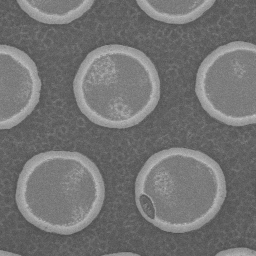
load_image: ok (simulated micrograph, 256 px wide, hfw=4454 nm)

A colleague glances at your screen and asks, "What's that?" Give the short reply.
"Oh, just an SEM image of raised bodies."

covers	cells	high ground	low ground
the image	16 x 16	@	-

--@@@----@@@@---
----------------
----------------
@-----@@@----@@@
@@---@@@@@---@@@
@@---@@@@@--@@@@
@@---@@@@@---@@@
@-----@@------@@
----------------
----------------
--@@@@---@@@@---
-@@@@@---@@@@@--
-@@@@@---@@@@@--
--@@@@----@@@---
----------------
----------------